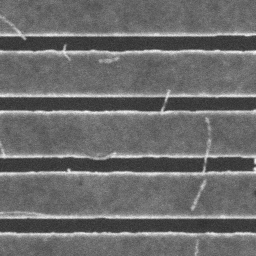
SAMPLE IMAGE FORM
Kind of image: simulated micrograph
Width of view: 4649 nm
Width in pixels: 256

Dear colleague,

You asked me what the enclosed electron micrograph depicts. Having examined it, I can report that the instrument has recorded lines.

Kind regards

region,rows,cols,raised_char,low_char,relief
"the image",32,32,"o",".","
oooooooooooooooooooooooooooooooo
oooooooooooooooooooooooooooooooo
oooooooooooooooooooooooooooooooo
oooooooooooooooooooooooooooooooo
..oo............................
................................
oooooooooooooo...oooooooooooo.oo
oooooooooooooooooooooooooooooooo
oooooooooooooooooooooooooooooooo
oooooooooooooooooooooooooooooooo
oooooooooooooooooooooooooooooooo
oooooooooooooooooooooooooooooooo
................................
................................
oooooooooooooooooooooooooooooooo
oooooooooooooooooooooooooooooooo
oooooooooooooooooooooooooooooooo
oooooooooooooooooooooooooooooooo
oooooooooooooooooooooooooooooooo
oooooooooooooooooooooooooooooooo
................................
.........................o......
oooooooooooooooooooooooooooooooo
oooooooooooooooooooooooooooooooo
oooooooooooooooooooooooooooooooo
oooooooooooooooooooooooooooooooo
oooooooooooooooooooooooooooooooo
................................
................................
oooooooooooooooooooooooooooooooo
oooooooooooooooooooooooooooooooo
oooooooooooooooooooooooooooooooo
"